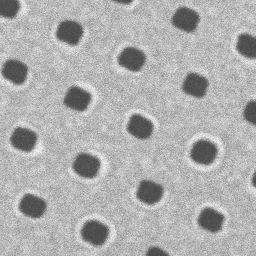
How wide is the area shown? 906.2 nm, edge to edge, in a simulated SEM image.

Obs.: a regular array of holes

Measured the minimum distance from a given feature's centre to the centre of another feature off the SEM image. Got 237 nanometers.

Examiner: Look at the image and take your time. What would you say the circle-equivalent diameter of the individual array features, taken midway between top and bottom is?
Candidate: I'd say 25.3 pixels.